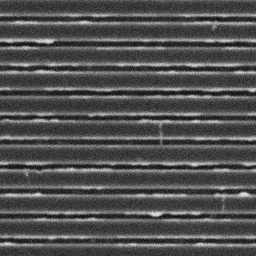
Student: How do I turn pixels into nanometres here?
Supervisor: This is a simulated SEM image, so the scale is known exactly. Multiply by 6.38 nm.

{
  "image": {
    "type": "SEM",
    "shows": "parallel lines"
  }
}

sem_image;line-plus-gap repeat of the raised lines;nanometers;157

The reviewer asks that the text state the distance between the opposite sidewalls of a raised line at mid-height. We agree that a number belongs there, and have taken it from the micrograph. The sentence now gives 120 nm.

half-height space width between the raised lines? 0.0343 microns